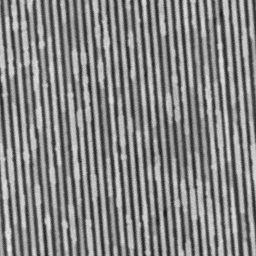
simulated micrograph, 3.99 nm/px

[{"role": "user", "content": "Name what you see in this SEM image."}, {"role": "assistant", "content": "parallel lines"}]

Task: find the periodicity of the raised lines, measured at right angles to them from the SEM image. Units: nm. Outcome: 32.4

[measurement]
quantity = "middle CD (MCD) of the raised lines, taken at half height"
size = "0.0134 um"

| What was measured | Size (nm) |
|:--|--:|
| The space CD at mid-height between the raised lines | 16.9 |